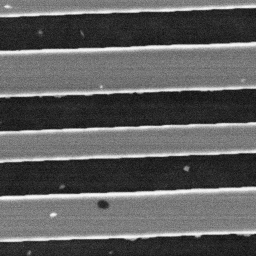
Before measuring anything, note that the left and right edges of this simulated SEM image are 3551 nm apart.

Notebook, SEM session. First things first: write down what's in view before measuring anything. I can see lines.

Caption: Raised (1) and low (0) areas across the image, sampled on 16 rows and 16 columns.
1111111111111110
0000000000000000
0000000000000000
1111111111111111
1111111111111111
1111111111111110
0000000000000000
0000000000000000
1111111111111111
1111111111111111
0000000000000000
0000000000000000
1111111111111111
1111111111111111
1111111111111111
0000000000000000